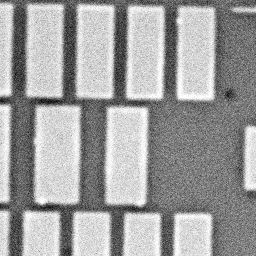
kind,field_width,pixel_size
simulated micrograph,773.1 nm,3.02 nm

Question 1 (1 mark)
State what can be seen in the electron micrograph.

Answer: wiring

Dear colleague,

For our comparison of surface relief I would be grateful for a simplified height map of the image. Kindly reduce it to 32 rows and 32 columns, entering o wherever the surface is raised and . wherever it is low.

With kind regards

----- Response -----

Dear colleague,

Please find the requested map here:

................................
oo..oooo..oooo..oooo..ooooo.....
o...oooo..oooo..oooo..ooooo.....
o...oooo..oooo..oooo..ooooo.....
o...oooo..oooo..oooo..ooooo.....
o..ooooo..oooo..oooo..ooooo.....
o..ooooo..oooo..oooo..ooooo.....
o..ooooo..oooo..oooo..ooooo.....
o..ooooo..oooo..oooo..ooooo.....
o..ooooo..oooo..oooo..ooooo.....
o..ooooo..oooo..oooo..ooooo.....
o..ooooo..oooo..oooo..ooooo.....
................................
o....ooooo......................
o....ooooo....oooo..............
o....ooooo....oooo..............
o....ooooo...ooooo.............o
o...oooooo...ooooo.............o
o....ooooo...ooooo.............o
o....ooooo...ooooo.............o
o....ooooo...ooooo.............o
o....ooooo...ooooo.............o
o....ooooo...ooooo.............o
o....ooooo...ooooo.............o
o....ooooo...ooooo..............
.................o..............
................................
o..oooo..ooooo..oooo..oooo......
o..oooo..ooooo..oooo..oooo......
o..oooo..ooooo..oooo..oooo......
o..oooo..ooooo..oooo..oooo......
o..oooo..ooooo..oooo..oooo......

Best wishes